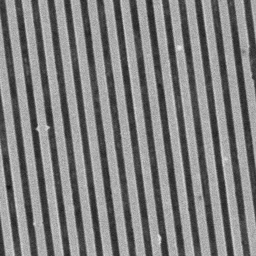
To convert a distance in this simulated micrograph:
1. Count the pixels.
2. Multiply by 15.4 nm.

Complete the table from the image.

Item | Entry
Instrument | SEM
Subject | parallel lines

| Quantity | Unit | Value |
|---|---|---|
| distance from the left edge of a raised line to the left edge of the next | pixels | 16.2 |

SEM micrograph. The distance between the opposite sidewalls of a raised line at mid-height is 134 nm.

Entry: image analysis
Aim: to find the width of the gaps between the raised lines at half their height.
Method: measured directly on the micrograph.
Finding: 7.07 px